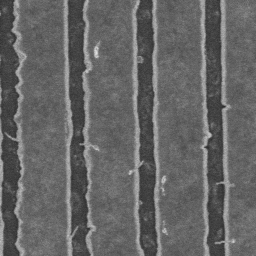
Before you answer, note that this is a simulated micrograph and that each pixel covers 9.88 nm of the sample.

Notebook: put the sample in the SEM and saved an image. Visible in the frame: one or a few lines or trenches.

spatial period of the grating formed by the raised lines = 676 nm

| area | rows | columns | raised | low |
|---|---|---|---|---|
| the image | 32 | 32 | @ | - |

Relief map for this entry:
--@@@@@@---@@@@@@--@@@@@@---@@@@
--@@@@@@---@@@@@@--@@@@@@---@@@@
--@@@@@@---@@@@@@--@@@@@@---@@@@
--@@@@@@---@@@@@@--@@@@@@---@@@@
--@@@@@@---@@@@@@--@@@@@@---@@@@
--@@@@@@---@@@@@@--@@@@@@---@@@@
--@@@@@@---@@@@@@--@@@@@@---@@@@
---@@@@@---@@@@@@--@@@@@@---@@@@
--@@@@@@---@@@@@@--@@@@@@---@@@@
--@@@@@@--@@@@@@@--@@@@@@---@@@@
--@@@@@@---@@@@@@--@@@@@@---@@@@
--@@@@@@---@@@@@@--@@@@@@@--@@@@
--@@@@@@---@@@@@@--@@@@@@@--@@@@
--@@@@@@@--@@@@@@--@@@@@@@--@@@@
--@@@@@@@--@@@@@@--@@@@@@@--@@@@
--@@@@@@@--@@@@@@--@@@@@@@--@@@@
--@@@@@@@--@@@@@@--@@@@@@@--@@@@
--@@@@@@@--@@@@@@--@@@@@@@--@@@@
--@@@@@@@--@@@@@@--@@@@@@@--@@@@
---@@@@@---@@@@@@--@@@@@@@--@@@@
---@@@@@---@@@@@@---@@@@@@--@@@@
---@@@@@---@@@@@@---@@@@@@--@@@@
--@@@@@@@--@@@@@@---@@@@@@--@@@@
---@@@@@@--@@@@@@---@@@@@@--@@@@
---@@@@@@--@@@@@@--@@@@@@@--@@@@
--@@@@@@@--@@@@@@--@@@@@@@--@@@@
--@@@@@@@--@@@@@@---@@@@@@--@@@@
--@@@@@@@--@@@@@@---@@@@@@--@@@@
--@@@@@@@--@@@@@@---@@@@@@--@@@@
--@@@@@@@--@@@@@@---@@@@@@--@@@@
--@@@@@@@--@@@@@@---@@@@@@--@@@@
---@@@@@@--@@@@@@@--@@@@@@--@@@@